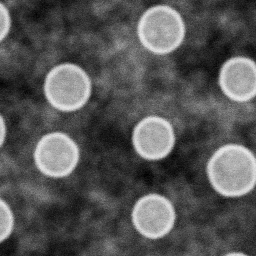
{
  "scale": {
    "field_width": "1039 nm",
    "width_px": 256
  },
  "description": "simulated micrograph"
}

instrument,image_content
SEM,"raised bodies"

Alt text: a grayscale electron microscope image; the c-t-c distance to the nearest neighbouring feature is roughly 318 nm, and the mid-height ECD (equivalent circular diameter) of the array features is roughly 162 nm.